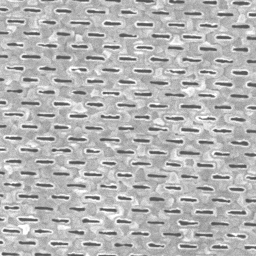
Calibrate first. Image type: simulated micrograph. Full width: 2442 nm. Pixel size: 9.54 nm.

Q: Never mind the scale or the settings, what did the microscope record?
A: a regular array of holes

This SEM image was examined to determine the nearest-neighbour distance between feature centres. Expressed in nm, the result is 178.